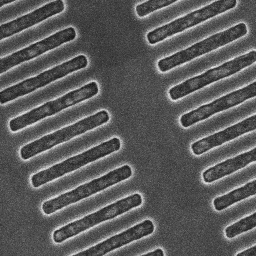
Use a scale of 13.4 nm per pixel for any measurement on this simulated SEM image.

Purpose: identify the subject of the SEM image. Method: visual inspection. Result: holes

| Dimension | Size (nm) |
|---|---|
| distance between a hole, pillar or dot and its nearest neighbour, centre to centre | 400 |